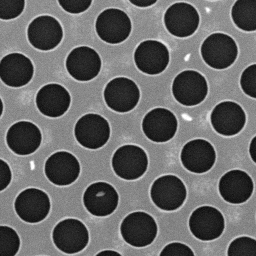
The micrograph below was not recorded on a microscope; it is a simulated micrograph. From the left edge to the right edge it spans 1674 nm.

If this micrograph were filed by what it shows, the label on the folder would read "a regular array of holes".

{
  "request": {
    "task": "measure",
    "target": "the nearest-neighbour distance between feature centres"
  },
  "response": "310 nanometres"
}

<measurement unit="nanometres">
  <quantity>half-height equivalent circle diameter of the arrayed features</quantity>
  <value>232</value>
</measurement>